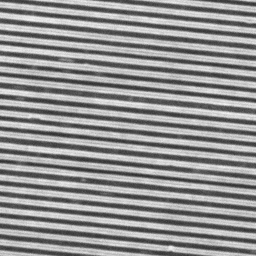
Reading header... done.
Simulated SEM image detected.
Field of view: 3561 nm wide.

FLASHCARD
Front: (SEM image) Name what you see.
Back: parallel lines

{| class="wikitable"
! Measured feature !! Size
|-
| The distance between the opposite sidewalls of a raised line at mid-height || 4.72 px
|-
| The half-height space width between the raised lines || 91.6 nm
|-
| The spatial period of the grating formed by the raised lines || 149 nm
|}